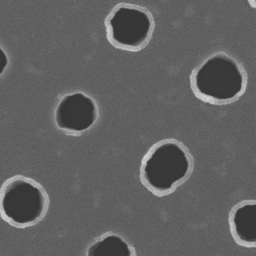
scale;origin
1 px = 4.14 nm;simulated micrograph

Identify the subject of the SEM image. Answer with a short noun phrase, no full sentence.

holes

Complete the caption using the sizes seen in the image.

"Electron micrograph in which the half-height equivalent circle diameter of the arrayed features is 0.161 micrometres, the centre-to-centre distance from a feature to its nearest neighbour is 0.423 micrometres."